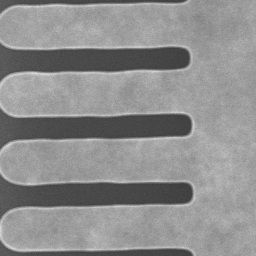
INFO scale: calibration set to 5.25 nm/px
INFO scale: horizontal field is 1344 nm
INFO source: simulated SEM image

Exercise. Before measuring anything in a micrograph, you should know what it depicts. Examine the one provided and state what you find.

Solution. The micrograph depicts groups of lines, slits or small figures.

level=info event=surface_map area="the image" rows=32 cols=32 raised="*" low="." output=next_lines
......**...*********************
********************************
********************************
********************************
********************************
********************************
........................********
........................********
.......................*********
.*******************************
********************************
********************************
********************************
********************************
.**************........*********
........................********
........................********
....**..************************
********************************
********************************
********************************
********************************
.*******************************
........................********
........................********
.......................*********
.*******************************
********************************
********************************
********************************
.*******************************
........................********